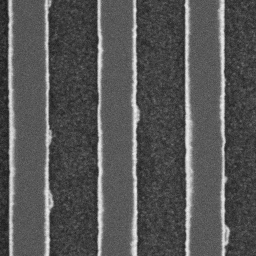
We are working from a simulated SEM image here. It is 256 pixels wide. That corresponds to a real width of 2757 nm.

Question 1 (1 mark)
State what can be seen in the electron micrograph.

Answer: lines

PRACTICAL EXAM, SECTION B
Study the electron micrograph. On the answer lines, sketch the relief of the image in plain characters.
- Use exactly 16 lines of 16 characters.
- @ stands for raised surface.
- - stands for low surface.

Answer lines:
-@@---@@----@@--
-@@---@@@---@@--
-@@---@@@---@@--
-@@---@@@---@@--
-@@---@@@---@@--
-@@---@@@---@@--
-@@---@@@---@@--
-@@---@@@---@@--
-@@---@@@---@@--
-@@---@@@---@@--
-@@---@@----@@--
-@@---@@@---@@--
-@@---@@@---@@--
-@@---@@@---@@--
-@@---@@@---@@--
-@@---@@@---@@--